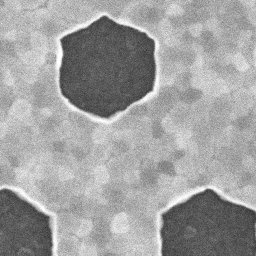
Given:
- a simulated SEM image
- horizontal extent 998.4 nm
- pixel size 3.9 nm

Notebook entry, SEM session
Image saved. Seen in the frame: holes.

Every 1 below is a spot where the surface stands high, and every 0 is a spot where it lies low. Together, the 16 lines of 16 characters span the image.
1111111111111111
1111110011111111
1111000000111111
1111000000111111
1111000000111111
1111000000111111
1111000011111111
1111111111111111
1111111111111111
1111111111111111
1111111111111111
1111111111111111
0011111111100011
0001111111000000
0001111111000000
0001111111000000